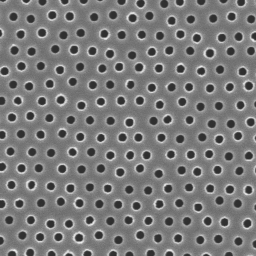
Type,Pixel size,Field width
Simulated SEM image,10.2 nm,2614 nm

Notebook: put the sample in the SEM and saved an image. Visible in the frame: a regular array of holes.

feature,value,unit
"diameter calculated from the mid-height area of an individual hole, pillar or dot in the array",85.5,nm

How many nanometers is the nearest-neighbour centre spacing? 178